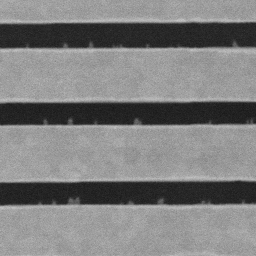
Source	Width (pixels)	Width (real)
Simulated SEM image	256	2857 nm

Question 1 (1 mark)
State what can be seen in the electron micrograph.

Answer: lines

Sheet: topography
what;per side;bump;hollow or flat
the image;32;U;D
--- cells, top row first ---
UUUUUUUUUUUUUUUUUUUUUUUUUUUUUUUU
UUUUUUUUUUUUUUUUUUUUUUUUUUUUUUUU
UUUUUUUUUUUUUUUUUUUUUUUUUUUUUUUU
DDDDDDDDDDDDDDDDDDDDDDDDDDDDDDDD
DDDDDDDDDDDDDDDDDDDDDDDDDDDDDDDD
DDDDDDDDDDDDDDDDDDDDDDDDDDDDDDDD
UUUUUUUUUUUUUUUUUUUUUUUUUUUUUUUU
UUUUUUUUUUUUUUUUUUUUUUUUUUUUUUUU
UUUUUUUUUUUUUUUUUUUUUUUUUUUUUUUU
UUUUUUUUUUUUUUUUUUUUUUUUUUUUUUUU
UUUUUUUUUUUUUUUUUUUUUUUUUUUUUUUU
UUUUUUUUUUUUUUUUUUUUUUUUUUUUUUUU
UUUUUUUUUUUUUUUUUUUUUUUUUUUUUUUU
DDDDDDDDDDDDDDDDDDDDDDDDDDDDDDDD
DDDDDDDDDDDDDDDDDDDDDDDDDDDDDDDD
DDDDDDDDDDDDDDDDDDDDDDDDDDDDDDDD
UUUUUUUUUUUUUUUUUUUUUUUUUUUUUUUU
UUUUUUUUUUUUUUUUUUUUUUUUUUUUUUUU
UUUUUUUUUUUUUUUUUUUUUUUUUUUUUUUU
UUUUUUUUUUUUUUUUUUUUUUUUUUUUUUUU
UUUUUUUUUUUUUUUUUUUUUUUUUUUUUUUU
UUUUUUUUUUUUUUUUUUUUUUUUUUUUUUUU
UUUUUUUUUUUUUUUUUUUUUUUUUUUUUUUU
DDDDDDDDDDDDDDDDDDDDDDDDDDDDDDDD
DDDDDDDDDDDDDDDDDDDDDDDDDDDDDDDD
DDDDDDDDDDDDDDDDDDDDDDDDDDDDDDDD
UUUUUUUUUUUUUUUUUUUUUUUUUUUUUUUU
UUUUUUUUUUUUUUUUUUUUUUUUUUUUUUUU
UUUUUUUUUUUUUUUUUUUUUUUUUUUUUUUU
UUUUUUUUUUUUUUUUUUUUUUUUUUUUUUUU
UUUUUUUUUUUUUUUUUUUUUUUUUUUUUUUU
UUUUUUUUUUUUUUUUUUUUUUUUUUUUUUUU